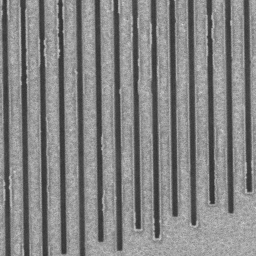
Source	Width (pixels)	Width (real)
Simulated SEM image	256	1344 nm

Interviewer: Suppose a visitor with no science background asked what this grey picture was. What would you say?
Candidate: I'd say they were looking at parallel lines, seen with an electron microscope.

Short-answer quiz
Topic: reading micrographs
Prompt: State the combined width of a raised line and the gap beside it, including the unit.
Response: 97.8 nanometers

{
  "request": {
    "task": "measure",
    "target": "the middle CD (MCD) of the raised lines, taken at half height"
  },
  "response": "13.3 px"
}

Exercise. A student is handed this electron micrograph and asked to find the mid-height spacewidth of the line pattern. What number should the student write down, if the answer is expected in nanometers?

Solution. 24.9